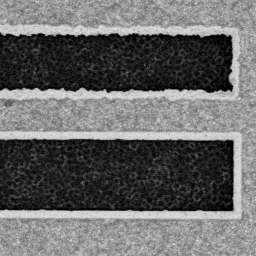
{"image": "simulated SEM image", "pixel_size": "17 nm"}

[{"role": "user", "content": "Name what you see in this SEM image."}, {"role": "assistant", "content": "one or a few lines or trenches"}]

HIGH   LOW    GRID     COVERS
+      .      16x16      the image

++++++++++++++++
++++++++++++++++
...............+
...............+
...............+
...............+
++++++++++++++++
++++++++++++++++
..............++
...............+
...............+
...............+
...............+
++++++++++++++++
++++++++++++++++
++++++++++++++++